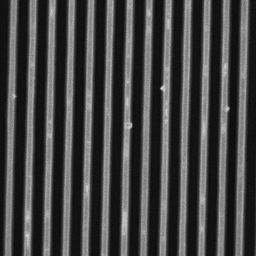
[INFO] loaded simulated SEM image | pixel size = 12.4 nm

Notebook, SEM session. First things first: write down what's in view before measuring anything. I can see parallel lines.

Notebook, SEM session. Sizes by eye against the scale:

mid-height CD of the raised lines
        0.0852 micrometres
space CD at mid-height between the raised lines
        146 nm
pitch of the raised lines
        239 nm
